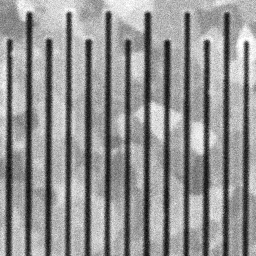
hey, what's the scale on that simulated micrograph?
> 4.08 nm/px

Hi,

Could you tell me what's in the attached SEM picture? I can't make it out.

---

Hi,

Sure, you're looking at parallel lines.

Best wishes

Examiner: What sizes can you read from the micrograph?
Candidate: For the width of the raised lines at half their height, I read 50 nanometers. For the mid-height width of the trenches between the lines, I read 0.0285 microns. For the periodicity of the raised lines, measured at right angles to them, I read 80.5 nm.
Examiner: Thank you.